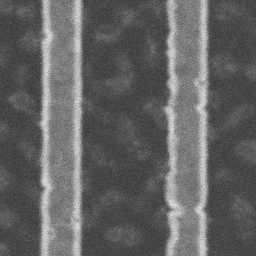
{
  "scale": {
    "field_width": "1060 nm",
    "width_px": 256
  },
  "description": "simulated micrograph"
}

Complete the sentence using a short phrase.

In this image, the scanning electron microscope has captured one or a few lines or trenches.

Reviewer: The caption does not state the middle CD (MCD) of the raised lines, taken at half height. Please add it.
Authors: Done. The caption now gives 134 nanometers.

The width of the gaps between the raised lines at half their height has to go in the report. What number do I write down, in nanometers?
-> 386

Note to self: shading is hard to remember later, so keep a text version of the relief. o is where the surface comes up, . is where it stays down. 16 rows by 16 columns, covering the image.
...oo......oo...
...oo......oo...
...oo......oo...
...oo......oo...
...oo......oo...
...oo......oo...
...oo......oo...
...oo......oo...
...oo......oo...
...oo......oo...
...oo......oo...
...oo......oo...
...oo......oo...
...oo......oo...
...oo......oo...
...oo......oo...